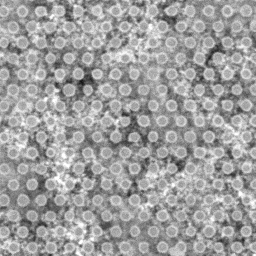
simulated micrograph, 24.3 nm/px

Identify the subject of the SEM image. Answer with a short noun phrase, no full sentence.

a regular array of raised bodies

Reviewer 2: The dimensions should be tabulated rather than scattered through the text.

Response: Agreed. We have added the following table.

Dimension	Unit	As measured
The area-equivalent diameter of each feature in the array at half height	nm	246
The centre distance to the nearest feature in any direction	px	18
